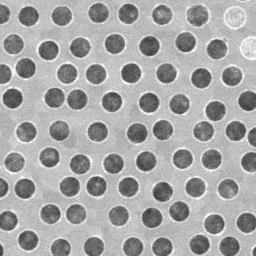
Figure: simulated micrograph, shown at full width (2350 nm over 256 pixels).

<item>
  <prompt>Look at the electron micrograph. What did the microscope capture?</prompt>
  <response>a regular array of holes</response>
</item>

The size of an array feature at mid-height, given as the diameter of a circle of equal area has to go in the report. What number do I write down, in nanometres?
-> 193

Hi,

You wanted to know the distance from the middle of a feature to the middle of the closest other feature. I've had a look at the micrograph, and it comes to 265 nm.